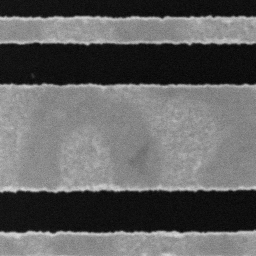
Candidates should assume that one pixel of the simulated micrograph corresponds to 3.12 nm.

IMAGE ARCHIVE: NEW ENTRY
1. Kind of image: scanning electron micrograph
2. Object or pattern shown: lines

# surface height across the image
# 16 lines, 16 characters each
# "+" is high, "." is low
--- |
................
++++++++++++++++
++++++++++++++++
................
................
++++++++++++++++
++++++++++++++++
++++++++++++++++
++++++++++++++++
++++++++++++++++
++++++++++++++++
++++++++++++++++
................
................
...............+
++++++++++++++++